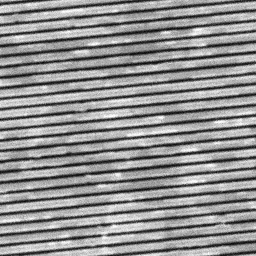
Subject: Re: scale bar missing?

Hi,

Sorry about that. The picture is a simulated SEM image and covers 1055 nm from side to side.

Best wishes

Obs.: parallel lines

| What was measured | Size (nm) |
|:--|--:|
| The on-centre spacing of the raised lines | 43.1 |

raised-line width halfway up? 7.45 pixels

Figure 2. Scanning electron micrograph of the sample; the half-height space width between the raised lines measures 15.4 nm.